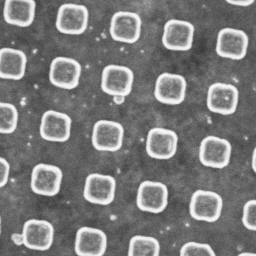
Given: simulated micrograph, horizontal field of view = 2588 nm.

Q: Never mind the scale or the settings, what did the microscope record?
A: a regular array of raised bodies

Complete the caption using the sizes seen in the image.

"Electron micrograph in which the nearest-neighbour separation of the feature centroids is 537 nanometers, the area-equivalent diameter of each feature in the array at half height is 29.2 px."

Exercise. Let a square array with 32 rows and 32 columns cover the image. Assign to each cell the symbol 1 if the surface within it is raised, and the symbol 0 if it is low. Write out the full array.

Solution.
01110000000000000000000000000010
01110000111000000000000000000000
01110001111000111000000000000000
00000001110000111000011100000000
00000000000000111000011100011110
00000000000000000000011100011110
11000000000000000000000000011110
11100001000000000000000000000000
11100011110000100000000000000000
11100011110001110000110000000000
00000001100001110000111000000000
00000000000000110000111000111100
00000000000000000000111000111100
11000000000000000000000000111000
11000011000000000000000000000000
11000111100011000000000000000000
00000111100011100001100000000000
00000001000011100001110000110000
00000000000011100011110001111000
00000000000000000001100001111000
10000000000000000000000000110000
10001110000000000000000000000000
10001110000111000000000000000000
00001110000111000011100000000000
00000000000111000111100011100000
00000000000000000111100011100001
00000000000000000000000011100001
00000000000000000000000000100001
00011100000000000000000000000000
00011100001110000000000000000000
00011100001110001111000000000000
00000000001110001111000111000000